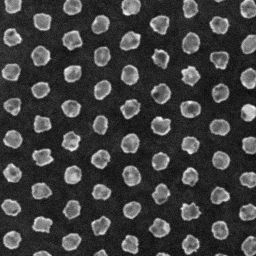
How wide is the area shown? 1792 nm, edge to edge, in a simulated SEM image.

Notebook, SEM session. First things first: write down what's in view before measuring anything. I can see a regular array of raised bodies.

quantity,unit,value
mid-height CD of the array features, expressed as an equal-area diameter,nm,120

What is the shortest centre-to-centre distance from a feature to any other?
0.229 µm